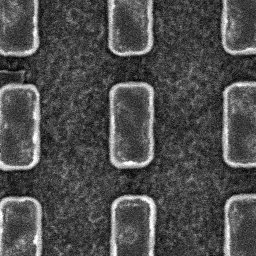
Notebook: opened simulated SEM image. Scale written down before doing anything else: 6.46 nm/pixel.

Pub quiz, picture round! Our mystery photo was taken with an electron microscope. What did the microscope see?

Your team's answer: raised bodies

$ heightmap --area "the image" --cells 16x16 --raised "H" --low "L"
HHLLLLLHHLLLLLHH
HHLLLLLHHLLLLLHH
HHLLLLLHHLLLLLHH
LLLLLLLLLLLLLLLL
LLLLLLLLLLLLLLLL
HHLLLLLHHLLLLLHH
HHLLLLLHHHLLLLHH
HHLLLLLHHHLLLLHH
HHLLLLLHHHLLLLHH
HHLLLLLHHHLLLLHH
LLLLLLLLLLLLLLLL
LLLLLLLLLLLLLLLL
HHLLLLLHHLLLLLHH
HHLLLLLHHHLLLLHH
HHLLLLLHHHLLLLHH
HHLLLLLHHLLLLLHH